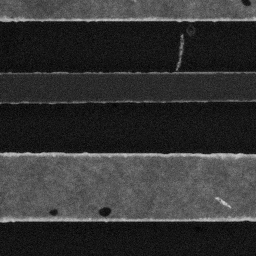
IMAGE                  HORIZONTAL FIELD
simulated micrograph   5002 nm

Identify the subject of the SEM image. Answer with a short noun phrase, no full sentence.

lines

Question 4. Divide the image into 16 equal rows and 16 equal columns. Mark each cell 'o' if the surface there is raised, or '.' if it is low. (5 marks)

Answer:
oooooooooooooooo
................
................
................
................
................
................
................
................
................
oooooooooooooooo
oooooooooooooooo
oooooooooooooooo
oooooooooooooooo
................
................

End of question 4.